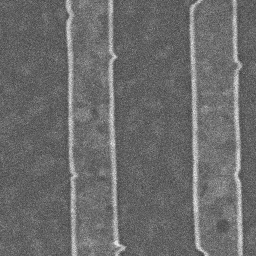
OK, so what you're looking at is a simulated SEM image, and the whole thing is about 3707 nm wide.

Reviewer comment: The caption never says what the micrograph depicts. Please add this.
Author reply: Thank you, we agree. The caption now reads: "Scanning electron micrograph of one or a few lines or trenches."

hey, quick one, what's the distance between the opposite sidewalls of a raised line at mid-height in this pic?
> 42.9 px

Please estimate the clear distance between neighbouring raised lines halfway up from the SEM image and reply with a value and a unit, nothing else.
1180 nm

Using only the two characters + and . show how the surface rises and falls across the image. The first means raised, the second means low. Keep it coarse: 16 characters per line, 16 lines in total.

....+++.....+++.
....+++.....+++.
....+++.....+++.
....+++.....+++.
....+++.....+++.
....+++.....+++.
....+++.....+++.
....+++.....+++.
....+++.....+++.
....+++.....+++.
....+++.....+++.
.....++.....+++.
.....++.....+++.
.....++.....+++.
.....++.....+++.
.....++......++.